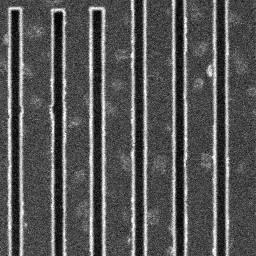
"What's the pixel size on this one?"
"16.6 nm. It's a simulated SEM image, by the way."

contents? parallel lines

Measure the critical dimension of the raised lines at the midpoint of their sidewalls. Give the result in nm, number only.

509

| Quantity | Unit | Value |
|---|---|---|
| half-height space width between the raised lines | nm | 180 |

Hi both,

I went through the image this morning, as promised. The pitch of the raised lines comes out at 0.675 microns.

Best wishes